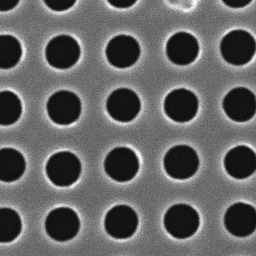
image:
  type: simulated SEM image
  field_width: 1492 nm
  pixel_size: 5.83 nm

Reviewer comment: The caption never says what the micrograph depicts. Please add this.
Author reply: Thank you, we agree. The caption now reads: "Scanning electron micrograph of a regular array of holes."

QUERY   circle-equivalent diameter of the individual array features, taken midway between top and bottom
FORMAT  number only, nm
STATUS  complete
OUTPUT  206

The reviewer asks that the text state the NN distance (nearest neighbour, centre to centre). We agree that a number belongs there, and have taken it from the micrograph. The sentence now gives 327 nanometres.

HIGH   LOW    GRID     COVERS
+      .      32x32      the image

..++++...+++++...+++++++++++...+
++++++++++++++++++++++++++++++++
++++++++++++++++++++++++++++++++
++++++++++++++++++++++++++++++++
..+++++..+++++..+++++...++++....
...+++....+++....++++....+++....
...+++....+++.....+++....+++....
..++++....+++....++++...++++...+
.++++++..++++++.++++++++++++++++
++++++++++++++++++++++++++++++++
++++++++++++++++++++++++++++++++
..+++++..+++++...++++...+++++..+
...+++....+++....++++....+++....
...+++....+++.....+++....+++....
...+++....++++...++++...++++....
..+++++..+++++++++++++++++++++++
++++++++++++++++++++++++++++++++
++++++++++++++++++++++++++++++++
..++++++++++++..+++++...+++++..+
...+++....+++....++++....+++....
...+++....+++....+++.....+++....
...+++....+++....++++....+++....
..++++....++++..++++++++++++++++
++++++++++++++++++++++++++++++++
++++++++++++++++++++++++++++++++
++++++++++++++++++++++.++++++..+
..++++...++++....++++....+++....
...+++....+++....+++.....+++....
...+++....+++....++++....+++....
..++++...+++++..+++++...+++++..+
++++++++++++++++++++++++++++++++
++++++++++++++++++++++++++++++++